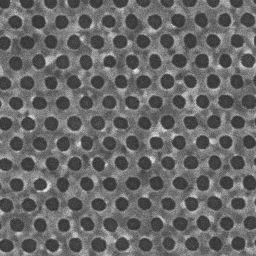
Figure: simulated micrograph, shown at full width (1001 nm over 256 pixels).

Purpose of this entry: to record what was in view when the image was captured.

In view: a regular array of holes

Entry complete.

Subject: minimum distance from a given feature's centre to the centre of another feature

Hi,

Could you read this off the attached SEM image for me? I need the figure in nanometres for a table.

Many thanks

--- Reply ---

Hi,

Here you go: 89.3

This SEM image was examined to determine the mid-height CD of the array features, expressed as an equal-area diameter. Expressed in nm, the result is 56.6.